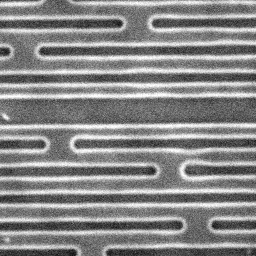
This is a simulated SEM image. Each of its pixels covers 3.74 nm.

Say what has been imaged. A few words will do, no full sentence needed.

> groups of lines, slits or small figures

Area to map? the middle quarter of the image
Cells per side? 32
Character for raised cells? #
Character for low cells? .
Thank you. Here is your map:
################################
################################
................................
................................
................................
################################
################################
################################
................................
................................
................................
................................
................................
................................
................................
####.###########################
################################
################################
####....#####.###########.......
##..............................
##..............................
###..########################...
################################
################################
################################
......................########..
.......................#######..
.......................#######..
################################
################################
################################
################################